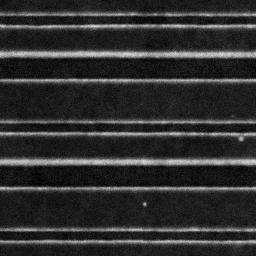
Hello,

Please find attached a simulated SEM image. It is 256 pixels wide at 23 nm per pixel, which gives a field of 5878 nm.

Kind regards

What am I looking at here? lines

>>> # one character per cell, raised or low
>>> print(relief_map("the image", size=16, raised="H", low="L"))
HHHHHHHHHHHHHHHH
HHHHHHHHHHHHHHHH
HHHHHHHHHHHHHHHH
LLLLLLLLLLLLLLLL
LLLLLLLLLLLLLLLL
HHHHHHHHHHHHHHHH
HHHHHHHHHHHHHHHH
HHHHHHHHHHHHHHHH
HHHHHHHHHHHHHHHH
HHHHHHHHHHHHHHHH
LLLLLLLLLLLLLLLL
LLLLLLLLLLLLLLLL
HHHHHHHHHHHHHHHH
HHHHHHHHHHHHHHHH
HHHHHHHHHHHHHHHH
HHHHHHHHHHHHHHHH